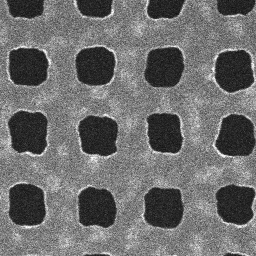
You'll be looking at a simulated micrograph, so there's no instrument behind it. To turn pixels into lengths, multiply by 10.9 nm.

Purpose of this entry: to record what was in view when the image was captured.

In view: a regular array of holes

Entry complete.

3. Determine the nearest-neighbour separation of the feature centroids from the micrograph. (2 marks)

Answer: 728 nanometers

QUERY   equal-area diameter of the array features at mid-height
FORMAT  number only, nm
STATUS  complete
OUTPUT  455